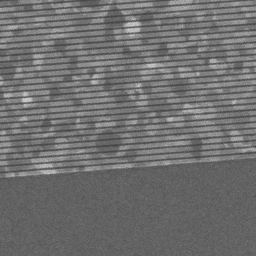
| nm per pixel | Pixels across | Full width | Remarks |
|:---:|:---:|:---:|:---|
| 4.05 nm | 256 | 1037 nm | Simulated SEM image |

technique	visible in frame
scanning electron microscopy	parallel lines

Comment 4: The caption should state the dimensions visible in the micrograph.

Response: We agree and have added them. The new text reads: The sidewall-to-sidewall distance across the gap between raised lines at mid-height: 14.1 nm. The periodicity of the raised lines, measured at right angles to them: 24.8 nanometers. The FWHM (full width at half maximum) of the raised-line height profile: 10.6 nanometers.